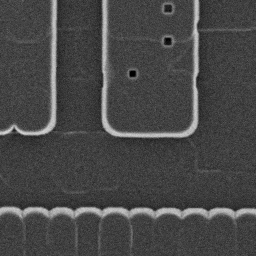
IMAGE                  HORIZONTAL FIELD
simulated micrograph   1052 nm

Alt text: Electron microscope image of wiring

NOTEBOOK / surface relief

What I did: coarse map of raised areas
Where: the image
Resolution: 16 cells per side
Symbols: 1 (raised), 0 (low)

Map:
1110000111110000
1110000111110000
1110000111110000
1110000111110000
1110000111110000
1110000111110000
1110000111110000
1110000111110000
0000000000000000
0000000000000000
0000000000000000
0000000000000000
0000000000000000
1111111111111111
1111111111111111
1111111111111111